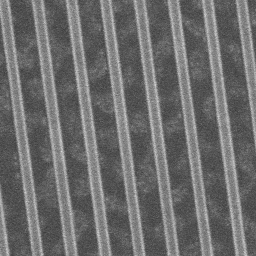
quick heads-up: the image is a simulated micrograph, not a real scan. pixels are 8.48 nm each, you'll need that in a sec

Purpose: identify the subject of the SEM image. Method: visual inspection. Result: parallel lines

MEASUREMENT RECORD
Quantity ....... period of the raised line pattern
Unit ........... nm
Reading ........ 286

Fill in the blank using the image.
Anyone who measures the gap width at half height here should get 203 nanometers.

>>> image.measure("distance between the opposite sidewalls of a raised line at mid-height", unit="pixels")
9.42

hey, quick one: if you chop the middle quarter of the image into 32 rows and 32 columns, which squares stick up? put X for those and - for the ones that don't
---XX------XXX------XX------XXX-
---XX-------XX------XX-------XX-
---XXX------XX------XXX------XX-
---XXX------XX------XXX------XX-
---XXX------XX-------XX------XX-
----XX------XX-------XX------XX-
----XX------XX-------XX------XX-
----XX------XXX------XX------XXX
----XX------XXX------XX------XXX
----XX-------XX------XX-------XX
----XXX------XX------XXX------XX
----XXX------XX------XXX------XX
-----XX------XX-------XX------XX
-----XX------XX-------XX------XX
-----XX------XX-------XX------XX
-----XX------XXX------XX------XX
-----XX-------XX------XX-------X
-----XXX------XX------XXX------X
-----XXX------XX------XXX------X
------XX------XX-------XX------X
------XX------XX-------XX------X
------XX------XX-------XX------X
------XX------XXX------XX------X
----X-XX------XXX------XX------X
------XX-------XX------XX-------
------XXX------XX------XXX------
------XXX------XX------XXX------
------XXX------XX------XXX------
X------XX------XX-------XX------
X------XX------XX-------XX------
X------XX------XXX------XX------
X------XX-------XX------XX------